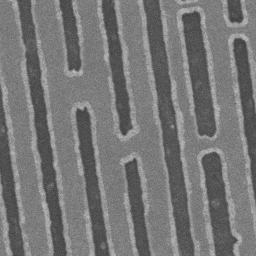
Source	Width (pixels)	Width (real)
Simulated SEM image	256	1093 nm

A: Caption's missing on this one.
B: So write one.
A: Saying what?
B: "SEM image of parallel lines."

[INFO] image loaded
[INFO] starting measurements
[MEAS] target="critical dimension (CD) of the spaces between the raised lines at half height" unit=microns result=0.0651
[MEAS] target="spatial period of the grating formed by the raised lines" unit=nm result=176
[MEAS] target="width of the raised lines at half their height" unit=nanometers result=114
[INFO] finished